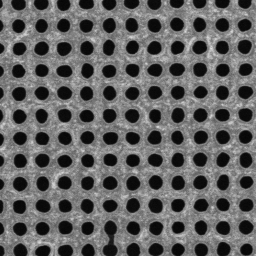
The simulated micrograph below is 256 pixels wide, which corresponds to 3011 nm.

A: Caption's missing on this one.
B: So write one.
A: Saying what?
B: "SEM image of a regular array of holes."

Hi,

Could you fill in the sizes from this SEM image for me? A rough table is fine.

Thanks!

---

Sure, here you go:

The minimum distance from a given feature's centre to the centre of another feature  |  0.26 um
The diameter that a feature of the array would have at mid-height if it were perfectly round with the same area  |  165 nm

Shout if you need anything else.